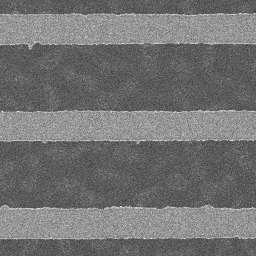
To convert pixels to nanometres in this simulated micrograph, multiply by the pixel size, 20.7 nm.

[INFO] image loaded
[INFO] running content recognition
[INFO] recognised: one or a few lines or trenches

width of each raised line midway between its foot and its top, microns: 0.607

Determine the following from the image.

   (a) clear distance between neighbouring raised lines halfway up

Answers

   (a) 1.39 um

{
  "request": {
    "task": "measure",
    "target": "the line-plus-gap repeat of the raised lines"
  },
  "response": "2010 nanometers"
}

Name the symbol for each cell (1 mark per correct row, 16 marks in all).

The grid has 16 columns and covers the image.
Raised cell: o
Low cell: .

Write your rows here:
................
oooooooooooooooo
oooooooooooooooo
................
................
................
................
oooooooooooooooo
oooooooooooooooo
................
................
................
................
oooooooooooooooo
oooooooooooooooo
................